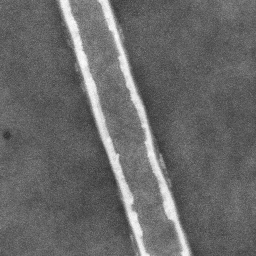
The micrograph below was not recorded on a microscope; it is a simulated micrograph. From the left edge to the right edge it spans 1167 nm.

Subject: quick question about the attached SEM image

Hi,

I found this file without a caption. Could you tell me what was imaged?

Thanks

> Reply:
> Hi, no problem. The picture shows one or a few lines or trenches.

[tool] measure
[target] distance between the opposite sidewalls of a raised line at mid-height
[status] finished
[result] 193 nanometres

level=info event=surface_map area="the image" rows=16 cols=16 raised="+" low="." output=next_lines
....+++.........
....+++.........
.....++.........
.....+++........
.....+++........
......++........
......+++.......
......+++.......
.......++.......
.......+++......
.......+++......
........++......
........+++.....
........+++.....
.........++.....
.........+++....